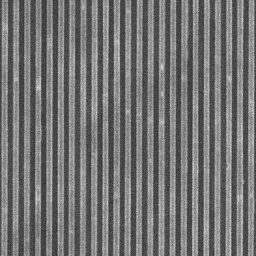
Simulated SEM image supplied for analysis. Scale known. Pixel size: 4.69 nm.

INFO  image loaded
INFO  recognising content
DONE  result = parallel lines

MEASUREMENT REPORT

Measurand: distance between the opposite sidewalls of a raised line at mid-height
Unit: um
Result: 0.0264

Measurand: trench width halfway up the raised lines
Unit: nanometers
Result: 27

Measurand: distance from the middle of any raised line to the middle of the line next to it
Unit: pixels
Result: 11.2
